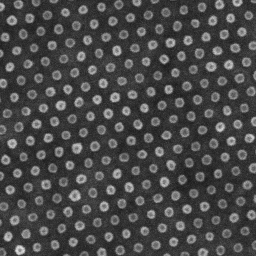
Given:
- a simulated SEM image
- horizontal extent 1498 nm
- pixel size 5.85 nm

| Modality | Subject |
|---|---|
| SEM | a regular array of raised bodies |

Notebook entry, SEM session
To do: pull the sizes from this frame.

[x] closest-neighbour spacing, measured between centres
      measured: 102 nm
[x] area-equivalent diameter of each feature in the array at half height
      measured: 48.9 nanometres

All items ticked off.